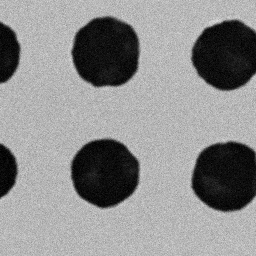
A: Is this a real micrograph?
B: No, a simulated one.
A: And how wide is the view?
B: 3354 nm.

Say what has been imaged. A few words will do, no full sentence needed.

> holes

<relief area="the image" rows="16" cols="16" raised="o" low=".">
oooooooooooooooo
ooooo...oooooo.o
.oooo....ooo....
.oooo....ooo....
.oooo...oooo....
ooooooooooooo..o
oooooooooooooooo
oooooooooooooooo
oooooooooooooooo
.oooo...ooooo...
.ooo.....ooo....
.oooo....ooo....
ooooo...ooooo...
oooooooooooooooo
oooooooooooooooo
oooooooooooooooo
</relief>